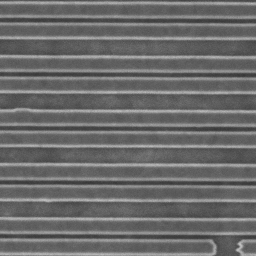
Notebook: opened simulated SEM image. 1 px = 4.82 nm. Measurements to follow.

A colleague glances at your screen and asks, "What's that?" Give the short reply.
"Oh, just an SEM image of parallel lines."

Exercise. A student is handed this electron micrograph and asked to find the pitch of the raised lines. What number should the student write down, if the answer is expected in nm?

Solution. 128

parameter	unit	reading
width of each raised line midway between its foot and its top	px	15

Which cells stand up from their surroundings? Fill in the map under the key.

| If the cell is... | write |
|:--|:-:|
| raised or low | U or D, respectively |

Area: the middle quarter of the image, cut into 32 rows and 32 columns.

UUUUUUUUUUUUUUUUUUUUUUUUUUUUUUUU
UUUUUUUUUUUUUUUUUUUUUUUUUUUUUUUU
DDDDDDDDDDDDDDDDDDDDDDDDDDDDDDDD
UDDDDDDDDDDDDDDDDDDDDDDDDDDDDDDD
UUUUUUUUUUUUUUUUUUUUUUUUUUUUUUUU
UUUUUUUUUUUUUUUUUUUUUUUUUUUUUUUU
UUUUUUUUUUUUUUUUUUUUUUUUUUUUUUUU
DDDDDDDDDDDDDDDDDDDDDDDDDDDDDDDD
DDDDDDDDDDDDDDDDDDDDDDDDDDDDDDDD
DDDDDDDDDDDDDDDDDDDDDDDDDDDDDDDD
DDDDDDDDDDDDDDDDDDDDDDDDDDDDDDDD
DDDDDDDDDDDDDDDDDDDDDDDDDDDDDDDD
UUUUUUUUUUUUUUUUUUUUUUUUUUUUUUUU
UUUUUUUUUUUUUUUUUUUUUUUUUUUUUUUU
UUUUUUUUUUUUUUUUUUUUUUUUUUUUUUUU
DDDDDDDDDDDDDDDDDDDDDDDDDDDDDDDD
DDDDDDDDDDDDDDDDDDDDDDDDDDDDDDDD
UUUUUUUUUUUUUUUUUUUUUUUUUUUUUUUU
UUUUUUUUUUUUUUUUUUUUUUUUUUUUUUUU
UUUUUUUUUUUUUUUUUUUUUUUUUUUUUUUU
UUUUUUUUUUUUUUUUDUUUUUDDDDUUUUUD
DDDDDDDDDDDDDDDDDDDDDDDDDDDDDDDD
DDDDDDDDDDDDDDDDDDDDDDDDDDDDDDDD
DDDDDDDDDDDDDDDDDDDDDDDDDDDDDDDD
DDDDDDDDDDDDDDDDDDDDDDDDDDDDDDDD
UUUUUUUUUUUUUUUUUUUUUUUUUUUUUUUU
UUUUUUUUUUUUUUUUUUUUUUUUUUUUUUUU
UUUUUUUUUUUUUUUUUUUUUUUUUUUUUUUU
UUUUUUUUUUUUUUUUUUUUUUUUUUUUUUUU
DDDDDDDDDDDDDDDDDDDDDDDDDDDDDDDD
DDDDDDDDDDDDDDDDDDDDDDDDDDDDDDDD
UUUUUUUUUUUUUUUUUUUUUUUUUUUUUUUU